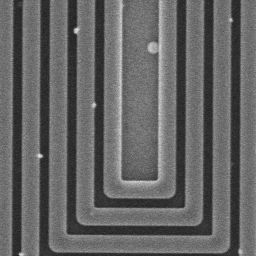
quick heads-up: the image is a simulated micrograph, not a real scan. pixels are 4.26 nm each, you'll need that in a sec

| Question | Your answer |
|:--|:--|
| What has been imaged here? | groups of lines, slits or small figures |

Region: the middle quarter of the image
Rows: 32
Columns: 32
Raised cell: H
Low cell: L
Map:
HLLHHHHLLLHHHHLLLLLLLLLLHHHHLLLH
HLLHHHHLLLHHHHLLLLLLLLLLHHHHLLLH
HLLHHHHLLLHHHHLLLLLLLLLLHHHHLLLH
HLLHHHHLLLHHHHLLLLLLLLLLHHHHLLLH
HLLHHHHLLLHHHHLLLLLLLLLLHHHHLLLH
HLLHHHHLLLHHHHLLLLLLLLLLHHHHLLLH
HLLHHHHLLLHHHHLLLLLLLLLLHHHHLLLH
LLLHHHHLLLHHHHLLLLLLLLLLHHHHLLLH
LLLHHHHLLLHHHHLLLLLLLLLLHHHHLLLH
LLLHHHHHLLHHHHLLLLLLLLLLHHHHLLLH
LLLHHHHHLLHHHHLLLLLLLLLLHHHHLLLH
LLLHHHHLLLHHHHLLLLLLLLLLHHHHLLLH
LLLHHHHLLLHHHHLLLLLLLLLLHHHHLLLH
LLLHHHHLLLHHHHLLLLLLLLLLHHHHLLLH
LLLHHHHLLLHHHHLLLLLLLLLLHHHHLLLH
LLLHHHHLLLHHHHLLLLLLLLLLHHHHLLLH
LLLHHHHLLLHHHHLLLLLLLLLLHHHHLLLH
LLLHHHHLLLHHHHLLLLLLLLLLHHHHLLLH
LLLHHHHLLLHHHHLLLLLLLLLLHHHHLLLH
LLLHHHHLLLHHHHLLLLLLLLLLHHHHLLLH
LLLHHHHLLLHHHHLLLLLLLLLLHHHHLLLH
LLLHHHHLLLHHHHLLLLLLLLLLHHHHLLLH
LLLHHHHLLLHHHHLLLLLLLLLLHHHHLLLH
LLLHHHHLLLHHHHLLLLLLLLLLHHHHLLLH
LLLHHHHLLLHHHHLLLLLLLLLLHHHHLLLH
LLLHHHHLLLHHHHLLLLLLLLLLHHHHLLLH
LLLHHHHLLLHHHHLLLLLLLLLLHHHHLLLH
LLLHHHHLLLHHHHLLLLLLLLLLHHHHLLLH
LLLHHHHLLLHHHHLLLLLLLLLLHHHHLLLH
LLLHHHHLLLHHHHHHHHHHHHHHHHHHLLLH
LLLHHHHLLLHHHHHHHHHHHHHHHHHHLLLH
LLLHHHHLLLHHHHHHHHHHHHHHHHHHLLLH